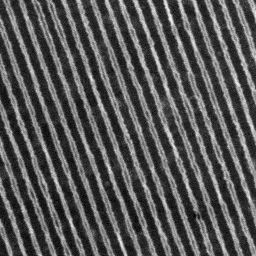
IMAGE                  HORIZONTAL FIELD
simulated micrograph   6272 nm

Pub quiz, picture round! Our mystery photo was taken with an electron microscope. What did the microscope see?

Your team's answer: parallel lines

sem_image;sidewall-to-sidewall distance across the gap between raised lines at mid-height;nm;240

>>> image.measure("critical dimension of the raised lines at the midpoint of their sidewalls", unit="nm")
95.2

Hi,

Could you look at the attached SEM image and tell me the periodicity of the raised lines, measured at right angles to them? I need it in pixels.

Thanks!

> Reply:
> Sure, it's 13.5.